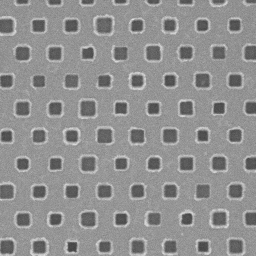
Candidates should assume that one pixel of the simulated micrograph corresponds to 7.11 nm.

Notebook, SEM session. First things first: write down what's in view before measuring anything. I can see a regular array of holes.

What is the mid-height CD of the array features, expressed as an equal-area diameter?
98.5 nm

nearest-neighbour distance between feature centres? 0.227 um